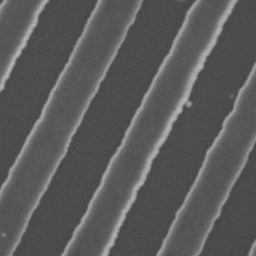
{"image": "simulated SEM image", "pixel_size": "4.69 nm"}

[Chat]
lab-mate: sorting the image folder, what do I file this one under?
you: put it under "lines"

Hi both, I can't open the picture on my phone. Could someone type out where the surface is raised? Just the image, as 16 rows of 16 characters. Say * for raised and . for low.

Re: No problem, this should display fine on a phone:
***...***...**..
**...***...***..
**...***...**...
*...***...***...
*...***...**....
...***...***...*
...***...**....*
..***...***...**
..***...**....**
.***...***...***
.***...**....**.
***...***...***.
**....**....**..
**...***...***..
*....**....**...
*...***...***...